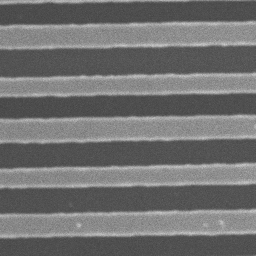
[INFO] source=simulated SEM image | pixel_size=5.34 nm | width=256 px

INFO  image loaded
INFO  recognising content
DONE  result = lines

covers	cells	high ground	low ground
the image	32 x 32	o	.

................................
................................
................................
oooooooooooooooooooooooooooooooo
oooooooooooooooooooooooooooooooo
oooooooooooooooooooooooooooooooo
................................
................................
................................
................oooooooooooooooo
oooooooooooooooooooooooooooooooo
oooooooooooooooooooooooooooooooo
................................
................................
.............................oo.
oooooooooooooooooooooooooooooooo
oooooooooooooooooooooooooooooooo
oooooooooooooooooooooo..........
................................
................................
................................
oooooooooooooooooooooooooooooooo
oooooooooooooooooooooooooooooooo
................................
................................
................................
..................oooooooooooooo
oooooooooooooooooooooooooooooooo
oooooooooooooooooooooooooooooooo
ooooooo.........................
................................
................................